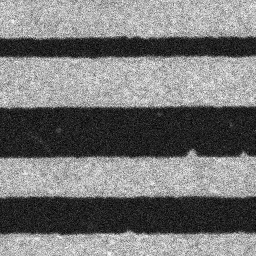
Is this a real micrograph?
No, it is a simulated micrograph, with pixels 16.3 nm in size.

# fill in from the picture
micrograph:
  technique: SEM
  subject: one or a few lines or trenches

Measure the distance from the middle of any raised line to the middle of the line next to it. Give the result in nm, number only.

1370